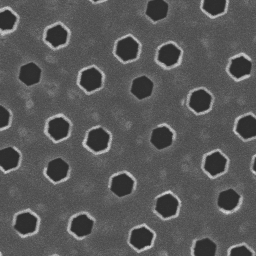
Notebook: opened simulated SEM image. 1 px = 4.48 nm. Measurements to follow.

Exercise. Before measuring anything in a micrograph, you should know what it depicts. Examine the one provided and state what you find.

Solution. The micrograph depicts a regular array of holes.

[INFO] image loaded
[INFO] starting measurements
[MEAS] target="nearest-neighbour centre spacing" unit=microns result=0.188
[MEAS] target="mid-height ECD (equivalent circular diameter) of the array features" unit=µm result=0.0976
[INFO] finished